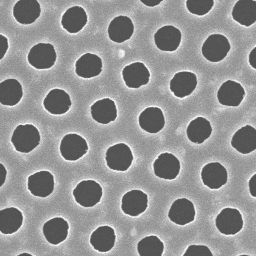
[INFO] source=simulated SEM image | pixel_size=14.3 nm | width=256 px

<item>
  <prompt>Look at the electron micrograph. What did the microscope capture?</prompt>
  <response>a regular array of holes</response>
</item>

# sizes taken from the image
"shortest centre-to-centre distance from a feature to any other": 680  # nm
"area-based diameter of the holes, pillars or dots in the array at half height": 0.383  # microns